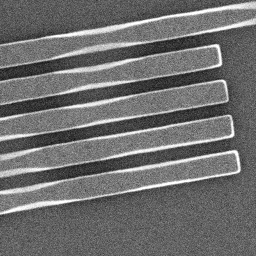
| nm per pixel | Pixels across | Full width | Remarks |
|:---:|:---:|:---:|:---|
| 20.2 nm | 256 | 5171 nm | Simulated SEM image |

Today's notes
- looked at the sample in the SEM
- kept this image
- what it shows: groups of lines, slits or small figures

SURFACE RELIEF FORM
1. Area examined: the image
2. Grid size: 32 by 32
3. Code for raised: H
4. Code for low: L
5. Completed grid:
LLLLLLLLLLLLLLLLLLLLLLLLLLLLLLLL
LLLLLLLLLLLLLLLLLLLLLLLLLHHHHHHH
LLLLLLLLLLLLLLLLLLLHHHHHHHHHHHHH
LLLLLLLLLLLLLLHHHHHHHHHHHHHHLLLL
LLLLLLLHHHHHHHHHHHHHHHHLLLLLLLLL
LHHHHHHHHHHHHHHHLLLLLLLLLLLLLLLL
HHHHHHHHHHLLLLLLLLLLLLHHHHHLLLLL
HHHHHHLLLLLLLLLLLHHHHHHHHHHLLLLL
LLLLLLLLLLLLHHHHHHHHHHHHHHLLLLLL
LLLLHHHHHHHHHHHHHHHHHLLLLLLLLLLL
HHHHHHHHHHHHHHLLLLLLLLLLLHHHLLLL
HHHHHHHHLLLLLLLLLLLHHHHHHHHHLLLL
HHHLLLLLLLLLLLHHHHHHHHHHHHHHLLLL
LLLLLLLHHHHHHHHHHHHHHHHHLLLLLLLL
LLHHHHHHHHHHHHHHHHLLLLLLLLLLLLLL
HHHHHHHHHHHHLLLLLLLLLLLHHHHHHLLL
HHHHHHHLLLLLLLLLLHHHHHHHHHHHHLLL
LLLLLLLLLLLHHHHHHHHHHHHHHHHLLLLL
LLLLLHHHHHHHHHHHHHHHLLLLLLLLLLLL
LHHHHHHHHHHHHHHLLLLLLLLLLLHHHHLL
HHHHHHHHHLLLLLLLLLLLHHHHHHHHHHLL
HHLLLLLLLLLLLLHHHHHHHHHHHHHHHLLL
LLLLLLLLHHHHHHHHHHHHHHHHHLLLLLLL
LLLLHHHHHHHHHHHHHHLLLLLLLLLLLLLL
HHHHHHHHHHHHHLLLLLLLLLLLLLLLLLLL
HHHHHHLLLLLLLLLLLLLLLLLLLLLLLLLL
HLLLLLLLLLLLLLLLLLLLLLLLLLLLLLLL
LLLLLLLLLLLLLLLLLLLLLLLLLLLLLLLL
LLLLLLLLLLLLLLLLLLLLLLLLLLLLLLLL
LLLLLLLLLLLLLLLLLLLLLLLLLLLLLLLL
LLLLLLLLLLLLLLLLLLLLLLLLLLLLLLLL
LLLLLLLLLLLLLLLLLLLLLLLLLLLLLLLL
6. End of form